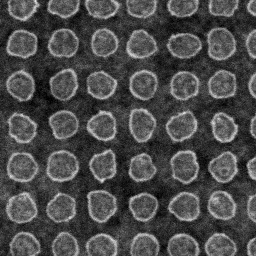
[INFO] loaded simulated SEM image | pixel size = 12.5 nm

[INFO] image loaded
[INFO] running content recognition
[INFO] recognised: a regular array of raised bodies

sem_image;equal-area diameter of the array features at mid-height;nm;349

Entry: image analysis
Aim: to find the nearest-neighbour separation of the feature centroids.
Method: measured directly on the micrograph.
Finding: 488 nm